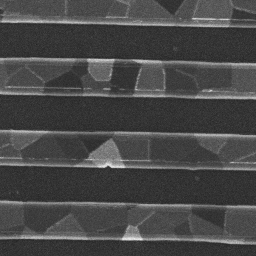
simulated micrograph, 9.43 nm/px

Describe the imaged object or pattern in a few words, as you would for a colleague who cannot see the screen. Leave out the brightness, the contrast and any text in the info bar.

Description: one or a few lines or trenches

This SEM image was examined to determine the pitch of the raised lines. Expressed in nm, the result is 676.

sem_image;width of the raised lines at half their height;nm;325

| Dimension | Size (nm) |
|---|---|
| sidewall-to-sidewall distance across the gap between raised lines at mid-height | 352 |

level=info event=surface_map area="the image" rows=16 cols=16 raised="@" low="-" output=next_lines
@@@@@@@@@@@@@@@@
--------@@@@@@@@
----------------
----------------
@@@@@@@@@@@@@@@@
@@@@@@@@@@@@@@@@
----------------
----------------
@@@@@@@@@@@@@@@@
@@@@@@@@@@@@@@@@
-----------@@-@@
----------------
----------------
@@@@@@@@@@@@@@@@
@@@@@@@@@@@@@@@@
----------------